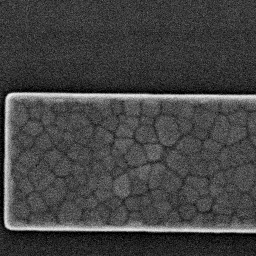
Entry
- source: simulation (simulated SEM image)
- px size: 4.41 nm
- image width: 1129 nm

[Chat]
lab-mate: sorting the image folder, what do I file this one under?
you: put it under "wiring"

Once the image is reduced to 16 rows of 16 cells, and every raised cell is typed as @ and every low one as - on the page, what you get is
----------------
----------------
----------------
----------------
----------------
----------------
@@@@@@@@@@@@@@@@
@@@@@@@@@@@@@@@@
@@@@@@@@@@@@@@@@
@@@@@@@@@@@@@@@@
@@@@@@@@@@@@@@@@
@@@@@@@@@@@@@@@@
@@@@@@@@@@@@@@@@
@@@@@@@@@@@@@@@@
----------------
----------------